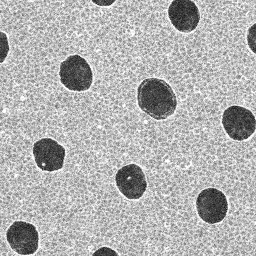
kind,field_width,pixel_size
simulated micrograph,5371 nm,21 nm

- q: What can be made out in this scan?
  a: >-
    holes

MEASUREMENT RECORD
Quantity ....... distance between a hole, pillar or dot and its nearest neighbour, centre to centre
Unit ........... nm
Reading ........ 1770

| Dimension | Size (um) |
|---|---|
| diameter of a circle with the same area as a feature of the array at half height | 0.72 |